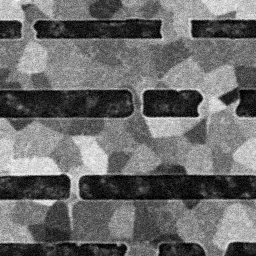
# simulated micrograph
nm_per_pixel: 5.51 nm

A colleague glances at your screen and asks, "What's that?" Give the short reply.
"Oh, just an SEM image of one or a few lines or trenches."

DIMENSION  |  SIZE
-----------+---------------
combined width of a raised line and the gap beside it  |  432 nanometres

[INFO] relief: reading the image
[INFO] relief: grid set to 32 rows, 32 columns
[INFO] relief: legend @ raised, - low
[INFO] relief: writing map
@@@@@@@@@@@@@@@@@@@@@@@@@@@@@@@@
@@@@@@@@@@@@@@@@@@@@@@@@@@@@@@@@
--@@@---------------@@@@--------
---@----------------@@@@--------
---@@---------------@@@@--------
@@@@@@@@@@@@@@@@@@@@@@@@@@@@@@@@
@@@@@@@@@@@@@@@@@@@@@@@@@@@@@@@@
@@@@@@@@@@@@@@@@@@@@@@@@@@@@@@@@
@@@@@@@@@@@@@@@@@@@@@@@@@@@@@@@@
@@@@@@@@@@@@@@@@@@@@@@@@@@@@@@@@
@@@@@@@@@@@@@@@@@@@@@@@@@@@@@@@@
----------------@@-------@@@@@--
-----------------@-------@@@@@--
-----------------@-------@@@@@--
----------------@@-------@@@@@--
@@@@@@@@@@@@@@@@@@@@@@@@@@@@@@@@
@@@@@@@@@@@@@@@@@@@@@@@@@@@@@@@@
@@@@@@@@@@@@@@@@@@@@@@@@@@@@@@@@
@@@@@@@@@@@@@@@@@@@@@@@@@@@@@@@@
@@@@@@@@@@@@@@@@@@@@@@@@@@@@@@@@
@@@@@@@@@@@@@@@@@@@@@@@@@@@@@@@@
@@@@@@@@@@@@@@@@@@@@@@@@@@@@@@@@
---------@----------------------
---------@----------------------
---------@----------------------
@@@@@@@@@@@@@@@@@@@@@@@@@@@@@@@@
@@@@@@@@@@@@@@@@@@@@@@@@@@@@@@@@
@@@@@@@@@@@@@@@@@@@@@@@@@@@@@@@@
@@@@@@@@@@@@@@@@@@@@@@@@@@@@@@@@
@@@@@@@@@@@@@@@@@@@@@@@@@@@@@@@@
----------------@@@@-----@@@@---
----------------@@@@------@@----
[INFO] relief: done